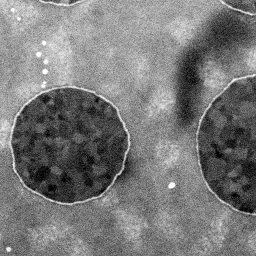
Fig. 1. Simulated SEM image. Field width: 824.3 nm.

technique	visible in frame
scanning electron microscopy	raised bodies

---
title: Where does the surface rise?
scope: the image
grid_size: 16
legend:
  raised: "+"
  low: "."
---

...............+
................
................
................
................
....+.........++
..+++++......+++
.+++++++.....+++
.+++++++....++++
.+++++++....++++
.+++++++.....+++
..+++++......+++
...+++........++
................
................
................